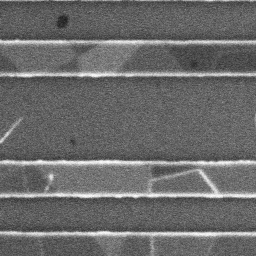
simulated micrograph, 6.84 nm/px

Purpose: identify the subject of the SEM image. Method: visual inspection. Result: lines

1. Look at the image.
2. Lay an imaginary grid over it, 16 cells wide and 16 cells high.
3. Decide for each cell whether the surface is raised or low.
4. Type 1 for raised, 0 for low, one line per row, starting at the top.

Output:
0000000000000000
0000000000000000
0000000000000000
1111111111111111
1111111111111111
0000000000000000
0000000000000000
0000000000000000
0000000000000000
0000000000000000
1111111111111111
1111111111111111
0000000000000000
0000000000000000
0000000000000000
1111111111111111